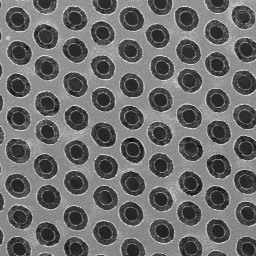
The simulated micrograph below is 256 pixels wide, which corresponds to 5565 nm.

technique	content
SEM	a regular array of ring-shaped grooves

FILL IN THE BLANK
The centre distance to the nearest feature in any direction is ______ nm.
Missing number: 683